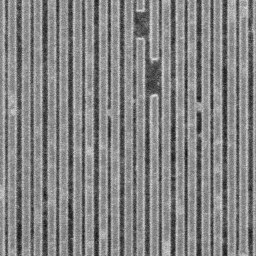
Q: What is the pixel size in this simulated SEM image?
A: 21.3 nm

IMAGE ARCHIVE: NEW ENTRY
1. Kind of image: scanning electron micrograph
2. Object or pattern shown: parallel lines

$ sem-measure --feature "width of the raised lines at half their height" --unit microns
0.149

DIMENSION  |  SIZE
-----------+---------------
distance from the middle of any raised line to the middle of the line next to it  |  273 nanometres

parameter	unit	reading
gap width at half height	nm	128